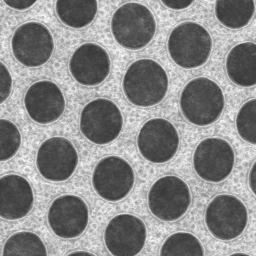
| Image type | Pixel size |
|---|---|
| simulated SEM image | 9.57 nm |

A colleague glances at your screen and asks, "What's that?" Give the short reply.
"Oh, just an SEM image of a regular array of holes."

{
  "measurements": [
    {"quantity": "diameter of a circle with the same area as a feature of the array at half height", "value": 0.412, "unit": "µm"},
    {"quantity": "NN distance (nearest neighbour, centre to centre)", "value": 0.558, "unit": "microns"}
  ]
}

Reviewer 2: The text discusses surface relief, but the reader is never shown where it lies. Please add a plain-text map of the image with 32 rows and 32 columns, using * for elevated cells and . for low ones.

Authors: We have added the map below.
*...***.....****..***...***.....
*******.....**.....********.....
********....**.....********....*
**....********.....***...****.**
**....********.....**.....******
*......****.***...***.....****..
**.....**....********.....***...
**....***.....***..***....**....
.********.....**....***.****....
.********....***.....********...
.***...***..***......**....***..
.**.....********.....**.....****
.**.....****.***....***.....****
***.....***....********.....**..
****...***.....********....***..
..********.....***...***..****..
..********.....**.....********..
...***..***...***.....****..***.
..***....********.....***....***
..***.....********....**.....***
*****.....**....********.....***
*****....***.....********....**.
...***..****.....***...***..***.
....********....***.....*******.
....****.****...***.....***..***
....***....********.....**....**
....**.....********....***.....*
******.....***....**..****.....*
******.....**.....********.....*
**...**...***.....***...***...**
*....********.....**.....*******
......****.***...***.....*******